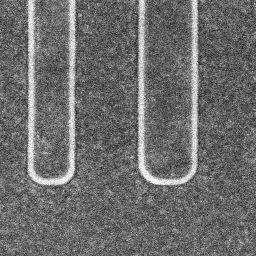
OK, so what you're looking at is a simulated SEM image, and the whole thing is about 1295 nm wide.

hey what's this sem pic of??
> one or a few lines or trenches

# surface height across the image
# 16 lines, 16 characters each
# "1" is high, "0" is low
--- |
0011100001110000
0011100001110000
0011100001110000
0011100001110000
0011000001110000
0011000001110000
0011000001110000
0011100001110000
0011100001110000
0011100001110000
0011000001110000
0000000000000000
0000000000000000
0000000000000000
0000000000000000
0000000000000000